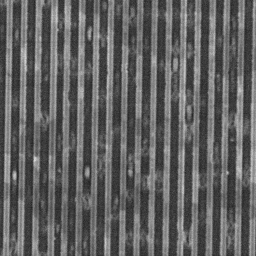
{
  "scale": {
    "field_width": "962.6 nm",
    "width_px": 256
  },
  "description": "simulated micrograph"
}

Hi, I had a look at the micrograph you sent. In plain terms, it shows parallel lines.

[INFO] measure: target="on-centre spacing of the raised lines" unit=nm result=54.5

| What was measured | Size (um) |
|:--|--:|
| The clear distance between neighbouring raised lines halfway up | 0.0362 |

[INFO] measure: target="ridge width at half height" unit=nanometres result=18.3